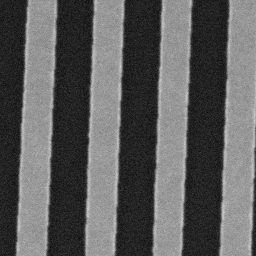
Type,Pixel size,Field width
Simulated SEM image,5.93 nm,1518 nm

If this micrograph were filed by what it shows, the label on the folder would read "lines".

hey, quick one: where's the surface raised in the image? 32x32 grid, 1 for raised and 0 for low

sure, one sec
00001110000011100000111100000111
00011110000011100000111100000111
00011110000011100000111100000111
00011110000011100000111100000111
00011110000011100000111100000111
00011110000011100000111100001111
00011110000011100000111100001111
00011110000011100000111100001111
00011110000011100000111100001111
00011110000011100000111100001111
00011110000111100000111000001111
00011110000111100000111000001111
00011110000111100000111000001111
00011100000111100000111000001111
00011100000111100000111000001111
00011100000111100000111000001111
00011100000111100000111000001111
00011100000111100000111000001111
00011100000111100000111000001111
00011100000111100000111000001111
00011100000111100000111000001111
00111100000111100000111000001111
00111100000111100000111000001111
00111100000111100000111000001111
00111100000111100000111000001111
00111100000111000000111000001110
00111100000111000001111000001110
00111100000111000001111000001110
00111100000111000001111000001110
00111100000111000001111000001110
00111100000111000001111000001110
00111100000111000001111000001110